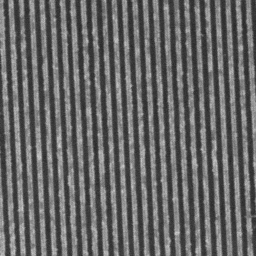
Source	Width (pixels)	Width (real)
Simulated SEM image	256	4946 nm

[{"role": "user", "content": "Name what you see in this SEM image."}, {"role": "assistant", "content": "parallel lines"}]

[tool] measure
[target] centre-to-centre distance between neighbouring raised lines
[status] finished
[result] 199 nanometers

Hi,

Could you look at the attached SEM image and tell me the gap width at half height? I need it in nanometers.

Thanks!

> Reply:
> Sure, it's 123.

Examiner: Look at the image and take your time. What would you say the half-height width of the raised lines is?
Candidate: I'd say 0.0772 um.